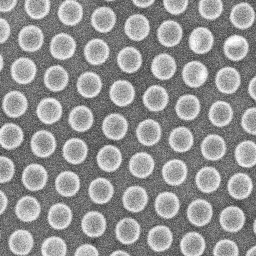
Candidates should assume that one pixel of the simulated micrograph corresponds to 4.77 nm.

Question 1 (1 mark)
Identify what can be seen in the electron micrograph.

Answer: a regular array of raised bodies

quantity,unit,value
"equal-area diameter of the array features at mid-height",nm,108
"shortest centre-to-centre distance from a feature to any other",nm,157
